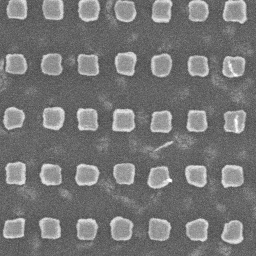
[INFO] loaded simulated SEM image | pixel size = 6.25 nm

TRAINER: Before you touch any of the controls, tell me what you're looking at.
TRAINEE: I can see a regular array of raised bodies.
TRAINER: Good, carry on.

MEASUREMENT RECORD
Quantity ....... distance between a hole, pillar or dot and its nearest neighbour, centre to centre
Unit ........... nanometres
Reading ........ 225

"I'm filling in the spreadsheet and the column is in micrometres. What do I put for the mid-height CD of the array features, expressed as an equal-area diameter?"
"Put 0.135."